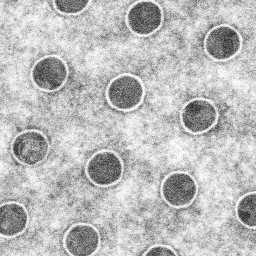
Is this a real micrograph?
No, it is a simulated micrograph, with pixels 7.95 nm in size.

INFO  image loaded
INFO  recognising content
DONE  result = raised bodies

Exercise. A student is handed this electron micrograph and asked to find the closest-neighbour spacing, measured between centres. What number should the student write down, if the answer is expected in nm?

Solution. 612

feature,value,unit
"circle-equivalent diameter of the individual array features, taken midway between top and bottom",0.285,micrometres